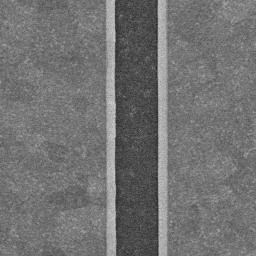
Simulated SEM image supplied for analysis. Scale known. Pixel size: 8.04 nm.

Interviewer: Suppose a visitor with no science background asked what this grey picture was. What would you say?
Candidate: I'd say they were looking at one or a few lines or trenches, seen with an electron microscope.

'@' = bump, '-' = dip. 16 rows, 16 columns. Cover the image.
@@@@@@@---@@@@@@
@@@@@@@---@@@@@@
@@@@@@@---@@@@@@
@@@@@@@---@@@@@@
@@@@@@@---@@@@@@
@@@@@@@---@@@@@@
@@@@@@@---@@@@@@
@@@@@@@---@@@@@@
@@@@@@@---@@@@@@
@@@@@@@---@@@@@@
@@@@@@@---@@@@@@
@@@@@@@---@@@@@@
@@@@@@@---@@@@@@
@@@@@@@---@@@@@@
@@@@@@@---@@@@@@
@@@@@@@---@@@@@@